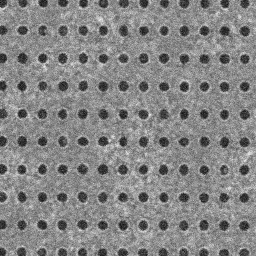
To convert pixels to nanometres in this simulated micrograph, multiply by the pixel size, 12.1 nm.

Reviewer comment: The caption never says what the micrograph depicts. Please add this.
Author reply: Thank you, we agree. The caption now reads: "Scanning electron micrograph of a regular array of holes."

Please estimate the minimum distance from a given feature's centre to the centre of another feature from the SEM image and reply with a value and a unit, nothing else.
244 nm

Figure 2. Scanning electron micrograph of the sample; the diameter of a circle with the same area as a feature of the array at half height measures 136 nanometres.